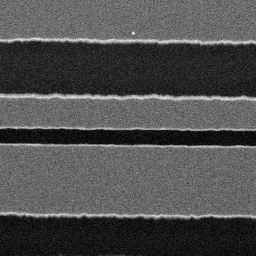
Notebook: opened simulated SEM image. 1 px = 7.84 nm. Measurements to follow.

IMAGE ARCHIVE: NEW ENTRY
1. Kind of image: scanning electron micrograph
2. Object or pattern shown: lines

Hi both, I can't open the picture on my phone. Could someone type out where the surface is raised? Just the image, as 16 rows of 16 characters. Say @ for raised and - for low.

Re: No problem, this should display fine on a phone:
@@@@@@@@@@@@@@@@
@@@@@@@@@@@@@@@@
@--@@@@@@@@@@@@@
----------------
----------------
----------------
@@@@@@@@@@@@@@@@
@@@@@@@@@@@@@@@@
@@@@@@@@@@@@@@@@
@@@@@@@@@@@@@@@@
@@@@@@@@@@@@@@@@
@@@@@@@@@@@@@@@@
@@@@@@@@@@@@@@@@
---------@-@@-@@
----------------
----------------